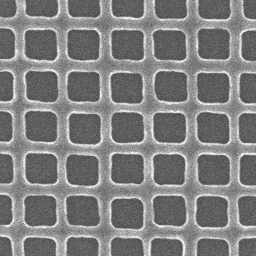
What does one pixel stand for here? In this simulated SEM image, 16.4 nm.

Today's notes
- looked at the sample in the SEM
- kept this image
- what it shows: a regular array of holes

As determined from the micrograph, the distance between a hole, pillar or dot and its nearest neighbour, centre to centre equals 677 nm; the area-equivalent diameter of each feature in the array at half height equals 35.2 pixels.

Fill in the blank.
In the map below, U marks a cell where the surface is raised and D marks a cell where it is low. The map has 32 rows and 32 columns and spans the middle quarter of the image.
UUUUUUUUUUUUUUUUUUUUUUUUUUUUUUUU
UUUUUUUUUUUUUUUUUUUUUUUUUUUUUUUU
UDDDDDDDDUUUDDDDDDDUUUUDDDDDDDUU
UDDDDDDDDUUDDDDDDDDDUUUDDDDDDDDU
UDDDDDDDDUUDDDDDDDDDUUUDDDDDDDDU
UDDDDDDDDUUDDDDDDDDDUUDDDDDDDDDU
DDDDDDDDDUUDDDDDDDDDUUUDDDDDDDDU
UDDDDDDDDUUUDDDDDDDDUUUDDDDDDDDU
UDDDDDDDDUUUDDDDDDDDUUUDDDDDDDDU
UUDDDUDDUUUUDDDDDDDUUUUUUUDDDDUU
UUUUUUUUUUUUUUUUUUUUUUUUUUUUUUUU
UUUUUUUUUUUUUUUUUUUUUUUUUUUUUUUU
UUDDDDDDUUUUDDDDDDDUUUUDDDDDDDUU
UDDDDDDDDUUUDDDDDDDDUUDDDDDDDDDU
UDDDDDDDDUUUDDDDDDDDUUDDDDDDDDDU
UDDDDDDDDUUUDDDDDDDDUUDDDDDDDDDU
UDDDDDDDDUUUDDDDDDDDUUDDDDDDDDDU
UDDDDDDDDUUUDDDDDDDDUUDDDDDDDDDU
UDDDDDDDDUUUDDDDDDDDUUDDDDDDDDDU
UUDDDDDDDUUUUDDDDDDDUUUDDDDDDDUU
UUUUUUUUUUUUUUUUUUUUUUUUUUUUUUUU
UUUUUUUUUUUUUUUUUUUUUUUUUUUUUUUU
UUUUUUUUUUUUDDDDDDDUUUUDDDDDDUUU
UDDDDDDDUUUUDDDDDDDDUUDDDDDDDDUU
DDDDDDDDDUUUDDDDDDDDUUDDDDDDDDUU
DDDDDDDDDUUUDDDDDDDDUUDDDDDDDDUU
UDDDDDDDDUUUDDDDDDDDUUDDDDDDDDUU
UDDDDDDDDUUUDDDDDDDDUUDDDDDDDDUU
UDDDDDDDDUUUDDDDDDDDUUDDDDDDDDUU
UDDDDDDDDUUUDDDDDDDDUUUDDDDDDDUU
UUUDDDDUUUUUUUUUUUUUUUUUDUUUUUUU
UUUUUUUUUUUUUUUUUUUUUUUUUUUUUUUU